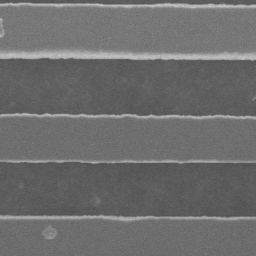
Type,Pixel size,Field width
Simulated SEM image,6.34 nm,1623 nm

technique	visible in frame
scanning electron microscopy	lines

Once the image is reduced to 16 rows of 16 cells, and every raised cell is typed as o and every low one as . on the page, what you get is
oooooooooooooooo
oooooooooooooooo
oooooooooooooooo
oooooooooooooooo
................
................
................
oooooooooooooooo
oooooooooooooooo
oooooooooooooooo
................
................
................
................
oooooooooooooooo
oooooooooooooooo